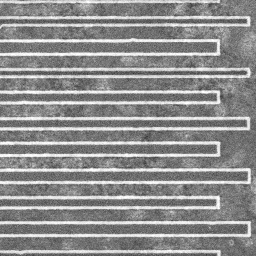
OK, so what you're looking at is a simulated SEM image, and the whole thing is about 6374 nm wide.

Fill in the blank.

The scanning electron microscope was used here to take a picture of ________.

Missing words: parallel lines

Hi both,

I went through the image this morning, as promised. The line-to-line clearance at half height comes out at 0.252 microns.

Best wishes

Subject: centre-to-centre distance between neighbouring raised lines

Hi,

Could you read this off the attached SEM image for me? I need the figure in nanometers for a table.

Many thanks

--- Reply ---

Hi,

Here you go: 647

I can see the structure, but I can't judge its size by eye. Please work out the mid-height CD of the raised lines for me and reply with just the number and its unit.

398 nm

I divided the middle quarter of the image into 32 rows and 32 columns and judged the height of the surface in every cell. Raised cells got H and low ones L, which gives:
HHHHHHHHHHHHHHHHHHHHHHHHHHHHHHHH
LLLLLLLLLLLLLLLLLLLLLLLLLLLLLLLL
LLLLLLLLLLLLLLLLLLLLLLLLLLLLLLLL
HHHHHHHHHHHHHHHHHHHHHHHHHHHHHHHH
HHHHHHHHHHHHHHHHHHHHHHHHHHHHHHHH
HHHHHHHHHHHHHHHHHHHHHHHHHHHHHHHH
HHHHHHHHHHHHHHHHHHHHHHHHHHHHHHHH
LLLLLLLLLLLLLLLLLLLLLLLLLLLLLLLL
LLLLLLLLLLLLLLLLLLLLLLLLLLLLLLLL
LLLLLLLLLLLLLLLLLLLLLLLLLLLLLLLL
HHHHHHHHHHHHHHHHHHHHHHHHHHHHHHHH
HHHHHHHHHHHHHHHHHHHHHHHHHHHHHHHH
HHHHHHHHHHHHHHHHHHHHHHHHHHHHHHHH
HHHHHHHHHHHHHHHHHHHHHHHHHHHHHHHH
LLLLLLLLLLLLLLLLLLLLLLLLLLLLLLLL
LLLLLLLLLLLLLLLLLLLLLLLLLLLLLLLL
HHHHHHHHHHHHHHHHHHHHHHHHHHHHHHHH
HHHHHHHHHHHHHHHHHHHHHHHHHHHHHHHH
HHHHHHHHHHHHHHHHHHHHHHHHHHHHHHHH
HHHHHHHHHHHHHHHHHHHHHHHHHHHHHHHH
LLLLLLLLLLLLLLLLLLLLLLLLLLLLLLLL
LLLLLLLLLLLLLLLLLLLLLLLLLLLLLLLL
LLLLLLLLLLLLLLLLLLLLLLLLLLLLLLLL
HHHHHHHHHHHHHHHHHHHHHHHHHHHHHHHH
HHHHHHHHHHHHHHHHHHHHHHHHHHHHHHHH
HHHHHHHHHHHHHHHHHHHHHHHHHHHHHHHH
LLLLLLLLLLLLLLLLLLLLLLLLLLLLLLLL
LLLLLLLLLLLLLLLLLLLLLLLLLLLLLLLL
LLLLLLLLLLLLLLLLLLLLLLLLLLLLLLLL
LLLLLLLLLLLLLLLLLLLLLLLLLLLLLLLL
HHHHHHHHHHHHHHHHHHHHHHHHHHHHHHHH
HHHHHHHHHHHHHHHHHHHHHHHHHHHHHHHH